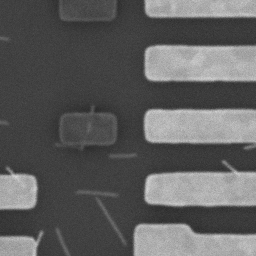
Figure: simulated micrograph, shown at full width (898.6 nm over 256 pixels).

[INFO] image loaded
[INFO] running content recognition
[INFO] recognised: wiring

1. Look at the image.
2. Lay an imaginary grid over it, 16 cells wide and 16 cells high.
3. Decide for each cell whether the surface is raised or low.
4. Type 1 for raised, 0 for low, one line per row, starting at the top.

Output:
0000111001111111
0000000000000000
0000000000000000
0000000001111111
0000000001111111
0000000000000000
0000000000000000
0000111001111111
0000111001111111
0000000000000000
0000000000000000
1100000001111111
1100000001111111
0000000000000000
0000000011110000
1100000011111111